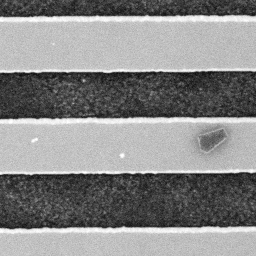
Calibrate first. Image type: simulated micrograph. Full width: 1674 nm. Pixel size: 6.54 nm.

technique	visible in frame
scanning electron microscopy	lines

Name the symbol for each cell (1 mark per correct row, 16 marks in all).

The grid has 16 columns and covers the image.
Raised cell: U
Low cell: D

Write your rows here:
DDDDDDDDDDDDDDDD
UUUUUUUUUUUUUUUU
UUUUUUUUUUUUUUUU
UUUUUUUUUUUUUUUU
UUUDUDUDDDDDDDDD
DDDDDDDDDDDDDDDD
DDDDDDDDDDDDDDDD
DDUDUUUUUUUUUUUU
UUUUUUUUUUUUUUUU
UUUUUUUUUUUUUUUU
UUUUUUUUUUUUUUUU
DDDDDDDDDDDDDDDD
DDDDDDDDDDDDDDDD
DDDDDDDDDDDDDDDD
UUUUUUUUUUUUUUUU
UUUUUUUUUUUUUUUU